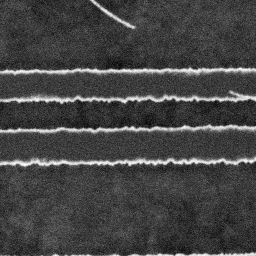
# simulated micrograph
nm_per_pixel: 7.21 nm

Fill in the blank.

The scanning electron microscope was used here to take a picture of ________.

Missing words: lines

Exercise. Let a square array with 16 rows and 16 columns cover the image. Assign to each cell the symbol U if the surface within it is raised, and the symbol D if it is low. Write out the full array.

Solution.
DDDDDDDDDDDDDDDD
DDDDDDDDDDDDDDDD
DDDDDDDDDDDDDDDD
DDDDDDDDDDDDDDDD
UUUUUUUUUUUUUUUU
UUUUUUUUUUUUUUUU
DDDDDDDDDDDDDDDD
DDDDDDDDDDDDDDDD
UUUUUUUUUUUUUUUU
UUUUUUUUUUUUUUUU
DDDDDDDDDDDDDDDD
DDDDDDDDDDDDDDDD
DDDDDDDDDDDDDDDD
DDDDDDDDDDDDDDDD
DDDDDDDDDDDDDDDD
DDDDDDDDDDDDDDDD